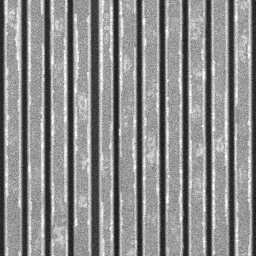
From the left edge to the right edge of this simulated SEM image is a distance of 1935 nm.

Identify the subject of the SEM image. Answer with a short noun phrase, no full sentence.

parallel lines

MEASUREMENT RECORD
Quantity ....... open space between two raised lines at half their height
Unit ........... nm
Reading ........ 51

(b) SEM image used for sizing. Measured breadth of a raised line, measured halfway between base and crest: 124 nanometers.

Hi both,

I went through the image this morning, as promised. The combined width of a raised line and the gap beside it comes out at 174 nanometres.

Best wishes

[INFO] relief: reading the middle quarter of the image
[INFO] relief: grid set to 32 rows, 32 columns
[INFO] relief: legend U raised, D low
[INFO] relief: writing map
UDDUUUDDDUUUDDUUUUDDUUUUDDUUUDDU
UDDUUUDDDUUUDDUUUUDDUUUUDDUUUDDU
UDDUUUDDDUUUDDUUUUDDUUUUDDUUUDDU
UDDUUUDDDUUUDDUUUUDDUUUUDDUUUDDU
UDDUUUDDDUUUDDUUUUDDUUUUDDUUUDDU
UDDUUUDDDUUUDDUUUUDDUUUUDDUUUDDU
UDDUUUDDDUUUDDUUUUDDUUUUDDUUUDDU
UDDUUUDDDUUUDDUUUUDDUUUUDDUUUDDU
UDDUUUDDDUUUDDUUUUDDUUUUDDUUUDDU
UDDUUUDDDUUUDDUUUUDDUUUUDDUUUDDU
UDDUUUDDDUUUDDUUUUDDUUUUDDUUUDDU
UDDUUUDDDUUUDDUUUUDDUUUUDDUUUDDU
UDDUUUDDDUUUDDUUUUDDUUUUDDUUUDDU
UDDUUUDDDUUUDDUUUUDDUUUUDDUUUDDU
UDDUUUDDDUUUDDUUUUDDUUUUDDUUUDDU
UDDUUUDDDUUUDDUUUUDDUUUUDDUUUDDU
UDDUUUDDDUUUDDUUUUDDUUUUDDUUUDDU
UDDUUUDDDUUUDDUUUUDDUUUUDDUUUDDU
UDDUUUDDDUUUDDUUUUDDUUUUDDUUUDDU
UDDUUUDDDUUUDDUUUUDDUUUUDDUUUDDU
UDDUUUDDDUUUDDUUUUDDUUUUDDUUUDDD
UDDUUUDDDUUUDDUUUUDDUUUUDDUUUDDD
UDDUUUDDDUUUDDUUUUDDUUUUDDUUUDDD
UDDUUUDDDUUUDDUUUUDDUUUUDDUUUDDD
UDDUUUDDDUUUDDUUUUDDUUUUDDUUUDDD
UDDUUUDDDUUUDDUUUUDDUUUUDDUUUDDD
UDDUUUDDDUUUDDUUUUDDUUUUDDUUUDDD
UDDUUUDDDUUUDDUUUUDDUUUUDDUUUDDD
UDDUUUDDDUUUDDUUUUDDUUUUDDUUUDDD
UDDUUUDDDUUUDDUUUUDDUUUUDDUUUDDD
UDDUUUDDDUUUDDUUUUDDUUUUDDUUUDDD
UDDUUUDDDUUUDDUUUUDDUUUUDDUUUDDD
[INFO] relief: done